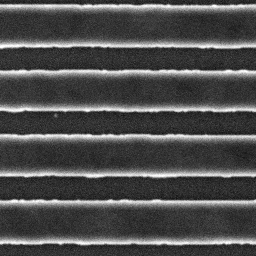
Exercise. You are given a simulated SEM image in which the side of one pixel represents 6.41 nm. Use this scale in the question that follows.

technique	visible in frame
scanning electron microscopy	lines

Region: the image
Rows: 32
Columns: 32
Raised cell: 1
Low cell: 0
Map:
00000000000000000000000000000000
11111111111111111111111111111111
11111111111111111111111111111111
11111111111111111111111111111111
11111111111111111111111111111111
11111111111111111111111111111111
00000000000000000000000000000000
00000000000000000000000000000000
00000000000000000000000000000000
11111111111111111111111111111111
11111111111111111111111111111111
11111111111111111111111111111111
11111111111111111111111111111111
11111111111111111111111111111111
00000000000000000000000000000000
00000000000000000000000000000000
00000000000000000000000000000000
11111111111111111111111111111111
11111111111111111111111111111111
11111111111111111111111111111111
11111111111111111111111111111111
11111111111111111111111111111111
00000000000000000000000000000000
00000000000000000000000000000000
00000000000000000000000000000000
11111111111111111111111111111111
11111111111111111111111111111111
11111111111111111111111111111111
11111111111111111111111111111111
11111111111111111111111111111111
00000000000000000000000000000000
00000000000000000000000000000000